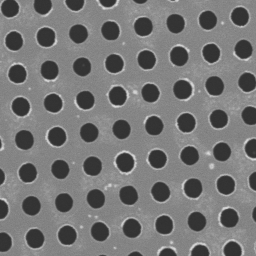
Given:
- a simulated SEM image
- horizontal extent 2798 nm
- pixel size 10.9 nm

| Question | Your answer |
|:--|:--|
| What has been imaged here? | a regular array of holes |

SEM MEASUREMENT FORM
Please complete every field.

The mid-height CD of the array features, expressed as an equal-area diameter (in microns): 0.206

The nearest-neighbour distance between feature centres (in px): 32.4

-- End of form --